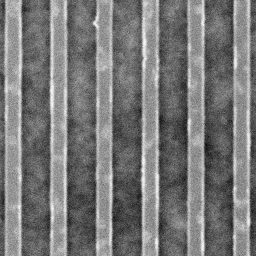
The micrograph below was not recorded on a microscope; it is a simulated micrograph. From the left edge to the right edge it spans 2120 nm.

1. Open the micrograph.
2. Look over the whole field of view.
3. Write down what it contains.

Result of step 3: parallel lines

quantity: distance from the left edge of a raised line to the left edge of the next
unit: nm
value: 378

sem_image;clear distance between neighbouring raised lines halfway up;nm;250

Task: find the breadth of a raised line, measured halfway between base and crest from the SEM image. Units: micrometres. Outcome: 0.128